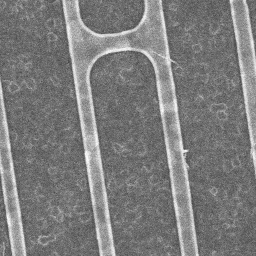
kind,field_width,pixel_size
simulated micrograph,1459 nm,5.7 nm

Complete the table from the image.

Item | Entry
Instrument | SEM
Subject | one or a few lines or trenches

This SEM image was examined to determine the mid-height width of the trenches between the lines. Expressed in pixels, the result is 68.7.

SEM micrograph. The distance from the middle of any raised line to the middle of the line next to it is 473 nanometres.